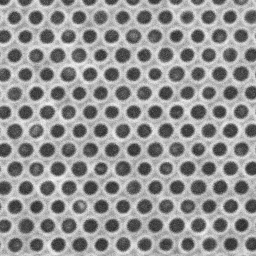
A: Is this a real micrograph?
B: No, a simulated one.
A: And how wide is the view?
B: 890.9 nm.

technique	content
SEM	a regular array of holes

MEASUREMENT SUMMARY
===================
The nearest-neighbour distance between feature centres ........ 74.5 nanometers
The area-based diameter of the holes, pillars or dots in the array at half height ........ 55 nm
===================